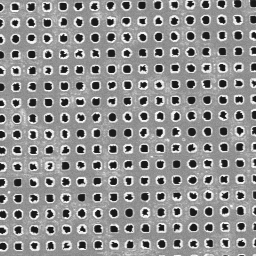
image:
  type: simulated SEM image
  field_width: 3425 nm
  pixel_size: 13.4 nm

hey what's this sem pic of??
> a regular array of holes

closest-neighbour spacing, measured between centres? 207 nm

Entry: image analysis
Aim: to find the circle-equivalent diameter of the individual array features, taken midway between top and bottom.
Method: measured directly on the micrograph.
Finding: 101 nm